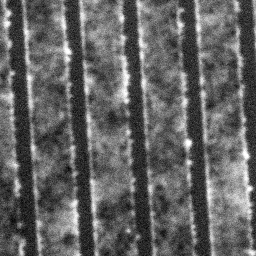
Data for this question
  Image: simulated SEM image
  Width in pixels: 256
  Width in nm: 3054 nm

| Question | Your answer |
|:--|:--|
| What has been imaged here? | lines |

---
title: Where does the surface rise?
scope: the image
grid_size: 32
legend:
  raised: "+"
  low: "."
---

+..+++++..+++++..+++++..++++++..
+..+++++..+++++..++++++..+++++..
+..+++++..+++++..+++++...+++++..
+..+++++..+++++..++++++..+++++..
+..+++++..+++++...+++++..+++++..
+..+++++..+++++...+++++..+++++..
+..+++++..+++++...+++++..+++++..
+..+++++..++++++..+++++..+++++..
+..+++++...+++++..+++++..+++++..
+..+++++...+++++..+++++..+++++..
+...+++++..+++++..+++++..+++++..
+...+++++..+++++..+++++..+++++..
+...+++++..+++++..+++++..+++++..
++..+++++..+++++..+++++..+++++..
++..+++++..+++++..+++++..+++++..
++..+++++..+++++..+++++..+++++..
++..+++++..+++++..+++++...++++..
++..+++++..+++++..++++++..+++++.
++..+++++..+++++..++++++..+++++.
++..+++++..+++++..++++++..+++++.
++..+++++..+++++..++++++..+++++.
++..+++++..+++++...+++++..+++++.
++..+++++..++++++..+++++..+++++.
++..+++++...+++++..+++++..+++++.
++..+++++...+++++..+++++..+++++.
++..+++++...+++++..+++++..+++++.
++...++++...+++++..+++++..+++++.
++...+++++..+++++..+++++..+++++.
++...+++++..+++++..+++++..+++++.
+++..+++++..+++++..+++++..+++++.
+++..+++++..+++++..+++++..+++++.
+++..+++++..+++++..+++++..++++++